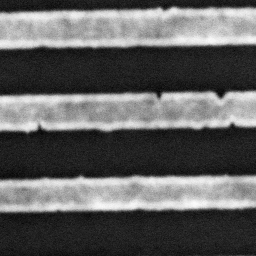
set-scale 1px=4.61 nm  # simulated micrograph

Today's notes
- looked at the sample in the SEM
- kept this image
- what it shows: one or a few lines or trenches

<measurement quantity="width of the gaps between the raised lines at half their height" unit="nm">250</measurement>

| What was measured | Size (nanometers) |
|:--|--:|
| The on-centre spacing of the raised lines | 381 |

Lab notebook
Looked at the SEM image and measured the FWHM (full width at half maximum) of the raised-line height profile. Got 0.133 microns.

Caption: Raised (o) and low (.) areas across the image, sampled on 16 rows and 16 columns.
................
oooooooooooooooo
oooooooooooooooo
................
................
................
oooooooooooooooo
oooooooooooooooo
................
................
................
oooooooooooooooo
oooooooooooooooo
................
................
................